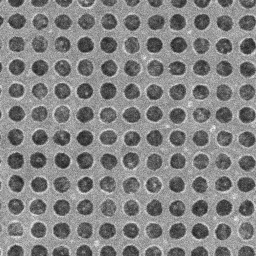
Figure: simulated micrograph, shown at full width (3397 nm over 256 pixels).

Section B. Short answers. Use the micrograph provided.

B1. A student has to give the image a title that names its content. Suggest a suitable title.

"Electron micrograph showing a regular array of holes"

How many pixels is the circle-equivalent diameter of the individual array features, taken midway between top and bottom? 17.1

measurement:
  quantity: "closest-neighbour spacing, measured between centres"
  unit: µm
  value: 0.299